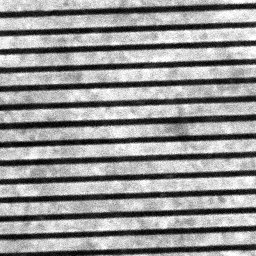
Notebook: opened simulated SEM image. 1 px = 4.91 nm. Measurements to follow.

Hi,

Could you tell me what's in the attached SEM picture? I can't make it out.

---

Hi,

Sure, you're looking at parallel lines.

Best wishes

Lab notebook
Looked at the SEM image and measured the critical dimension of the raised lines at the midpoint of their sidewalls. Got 57.7 nm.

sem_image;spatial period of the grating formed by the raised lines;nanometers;90.8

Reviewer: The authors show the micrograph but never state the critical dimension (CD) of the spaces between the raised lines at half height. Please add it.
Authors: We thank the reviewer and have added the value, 31.3 nm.